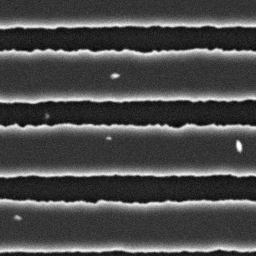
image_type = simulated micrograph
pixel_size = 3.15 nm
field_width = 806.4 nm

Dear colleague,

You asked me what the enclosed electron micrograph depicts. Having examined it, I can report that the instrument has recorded lines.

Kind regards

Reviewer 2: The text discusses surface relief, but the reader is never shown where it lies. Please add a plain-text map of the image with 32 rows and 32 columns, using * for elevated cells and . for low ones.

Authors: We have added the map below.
********************************
********************************
********************************
*.....*.........................
................................
................................
*****************..*************
********************************
********************************
********************************
********************************
********************************
*******************.**.***.***..
................................
................................
........*.......................
********************************
********************************
********************************
********************************
********************************
********************************
................................
................................
................................
********************************
********************************
********************************
********************************
********************************
********************************
................................